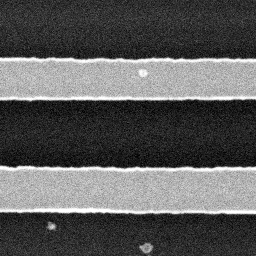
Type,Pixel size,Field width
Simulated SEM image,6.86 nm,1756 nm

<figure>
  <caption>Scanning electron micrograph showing lines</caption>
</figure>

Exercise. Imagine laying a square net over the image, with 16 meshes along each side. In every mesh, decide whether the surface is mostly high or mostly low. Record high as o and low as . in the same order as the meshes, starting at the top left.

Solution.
................
................
................
................
oooooooooooooooo
oooooooooooooooo
................
................
................
................
oooo.oo....o..oo
oooooooooooooooo
oooooooooooooooo
................
................
................